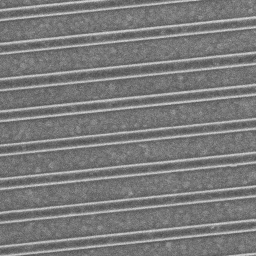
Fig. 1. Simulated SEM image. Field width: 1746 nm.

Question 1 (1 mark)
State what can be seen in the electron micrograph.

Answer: parallel lines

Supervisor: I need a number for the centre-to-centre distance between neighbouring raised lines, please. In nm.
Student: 229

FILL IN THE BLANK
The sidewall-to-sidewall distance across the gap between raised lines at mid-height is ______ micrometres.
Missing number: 0.16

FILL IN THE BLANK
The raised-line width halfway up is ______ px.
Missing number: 10.1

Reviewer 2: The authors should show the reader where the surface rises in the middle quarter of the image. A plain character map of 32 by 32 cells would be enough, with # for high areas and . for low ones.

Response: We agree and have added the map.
...............#################
......##########################
#######################.........
##############..................
####............................
................................
................................
.........................#######
...............#################
......#########################.
#####################...........
###########.....................
##..............................
................................
................................
...............................#
......................##########
............####################
...######################.......
################................
######..........................
................................
................................
................................
..........................######
................################
.......######################...
####################............
##########......................
#...............................
................................
................................